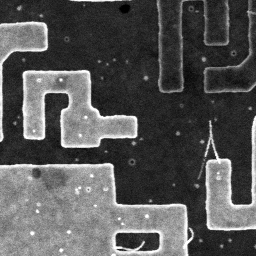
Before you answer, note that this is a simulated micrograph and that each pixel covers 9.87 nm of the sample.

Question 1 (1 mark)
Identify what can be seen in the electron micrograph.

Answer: wiring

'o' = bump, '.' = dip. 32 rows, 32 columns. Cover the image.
....................ooo...oo...o
....................ooo...oo...o
....................ooo...oo...o
oooooo..............ooo...oo...o
oooooo..............ooo...oo...o
oooooo..............ooo...oo...o
oo..................ooo........o
o...................ooo........o
....................ooo...oooooo
...oooooooo.........ooo...oooooo
...oooooooo.........ooo...oooooo
...oooooooo...............o.....
...oo....oo.....................
...oo...oooo....................
...oo...ooooo...................
...oo...ooooooooo...............
...oo...ooooooooo...............
........ooooo...................
................................
................................
..........................ooo...
oooooooooooooo............ooo...
oooooooooooooo............ooo...
oooooooooooooo............ooo...
oooooooooooooo............ooo...
ooooooooooooooo...........ooo..o
ooooooooooooooooooooooo...oooooo
ooooooooooooooooooooooo...oooooo
ooooooooooooooooooooooo...oooooo
oooooooooooooo......ooo.........
oooooooooooooo......ooo.........
ooooooooooooooooooooooo.........